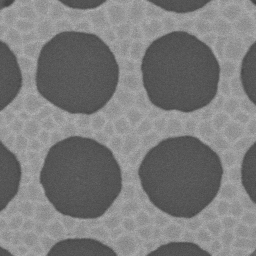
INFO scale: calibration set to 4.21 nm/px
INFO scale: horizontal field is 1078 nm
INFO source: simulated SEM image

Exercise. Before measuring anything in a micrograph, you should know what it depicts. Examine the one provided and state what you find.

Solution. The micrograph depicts holes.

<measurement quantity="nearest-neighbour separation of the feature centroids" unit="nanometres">428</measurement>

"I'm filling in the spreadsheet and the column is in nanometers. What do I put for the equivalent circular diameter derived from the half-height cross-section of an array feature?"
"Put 343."